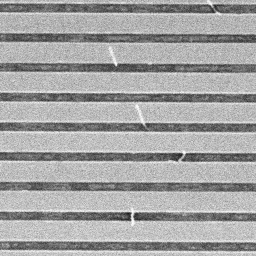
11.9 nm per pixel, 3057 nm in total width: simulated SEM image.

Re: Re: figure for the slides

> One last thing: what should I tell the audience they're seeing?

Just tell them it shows parallel lines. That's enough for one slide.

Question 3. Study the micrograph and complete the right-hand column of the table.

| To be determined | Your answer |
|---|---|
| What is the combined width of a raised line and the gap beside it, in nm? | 355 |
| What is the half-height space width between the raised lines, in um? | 0.115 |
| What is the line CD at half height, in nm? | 242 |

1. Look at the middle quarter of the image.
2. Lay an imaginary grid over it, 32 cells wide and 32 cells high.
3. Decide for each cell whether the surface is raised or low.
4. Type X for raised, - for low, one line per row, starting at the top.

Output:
--------------------------------
--------------------------------
XXXXXXXXXXXXXXXXXXXXXXXXXXXXXXXX
XXXXXXXXXXXXXXXXXXXXXXXXXXXXXXXX
XXXXXXXXXXXXXXXXXXXXXXXXXXXXXXXX
XXXXXXXXXXXXXXXXXXXXXXXXXXXXXXXX
XXXXXXXXXXXXXXXXXXXXXXXXXXXXXXXX
--------------------------------
--------------------------------
--------------------------------
XXXXXXXXXXXXXXXXXXXXXXXXXXXXXXXX
XXXXXXXXXXXXXXXXXXXXXXXXXXXXXXXX
XXXXXXXXXXXXXXXXXXXXXXXXXXXXXXXX
XXXXXXXXXXXXXXXXXXXXXXXXXXXXXXXX
XXXXXXXXXXXXXXXXXXXXXXXXXXXXXXXX
--------------------------------
--------------------------------
XXXXXXXXXXXXXXXXXXXXXXXXXXXXXXXX
XXXXXXXXXXXXXXXXXXXXXXXXXXXXXXXX
XXXXXXXXXXXXXXXXXXXXXXXXXXXXXXXX
XXXXXXXXXXXXXXXXXXXXXXXXXXXXXXXX
XXXXXXXXXXXXXXXXXXXXXXXXXXXXXXXX
--------------------------------
--------------------------------
XXXXXXXXX----------------XXX-X--
XXXXXXXXXXXXXXXXXXXXXXXXXXXXXXXX
XXXXXXXXXXXXXXXXXXXXXXXXXXXXXXXX
XXXXXXXXXXXXXXXXXXXXXXXXXXXXXXXX
XXXXXXXXXXXXXXXXXXXXXXXXXXXXXXXX
----------X---------------------
--------------------------------
--------------------------------